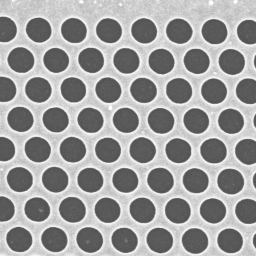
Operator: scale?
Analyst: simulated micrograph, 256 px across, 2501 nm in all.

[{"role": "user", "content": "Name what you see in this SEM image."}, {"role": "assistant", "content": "a regular array of holes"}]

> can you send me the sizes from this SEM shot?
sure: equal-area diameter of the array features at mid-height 253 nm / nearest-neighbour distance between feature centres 336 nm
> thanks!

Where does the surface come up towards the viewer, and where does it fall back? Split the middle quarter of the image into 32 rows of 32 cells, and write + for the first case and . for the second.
.+++......+++......++......+++..
+++++....++++.....++++.....++++.
+++++++++++++++.++++++++.+++++++
+..+++++++..++++++...+++++++++++
.....+++.....++++.....++++.....+
.....+++......+++......+++......
......++.......+.......++.......
.....+++......+++......+++......
.....++++.....+++......+++......
+...++++++...++++++..++++++....+
++++++++++++++++++++++++++++++++
+++++...+++++....+++++....+++++.
.+++.....+++......+++......+++..
.++.......++.......++.......++..
.++.......++.......++.......++..
.+++......+++.....+++......+++..
+++++....++++.....++++.....++++.
++++++++++++++++++++++++.+++++++
...+++++++..++++++...+++++++.+++
.....+++......+++.....++++.....+
.....+++......+++......++.......
......++......++.......++.......
.....+++......++.......++.......
.....+++......+++.....++++.....+
+..+++++++...+++++...++++++...++
++++++++++++++++++++++++++++++++
++++.....++++....+++++....+++++.
.+++.....+++......+++......+++..
.++.......++.......++......+++..
.++.......++.......++.......++..
.+++......++.......++......+++..
+++++....++++.....++++....+++++.